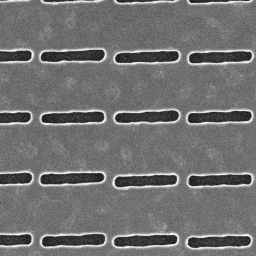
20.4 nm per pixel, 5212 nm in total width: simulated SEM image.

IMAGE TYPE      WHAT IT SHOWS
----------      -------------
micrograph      a regular array of holes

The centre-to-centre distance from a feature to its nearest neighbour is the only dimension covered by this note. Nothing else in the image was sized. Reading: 1230 nm